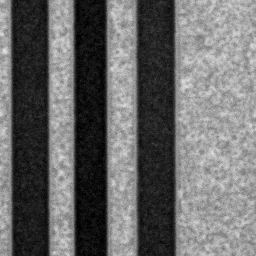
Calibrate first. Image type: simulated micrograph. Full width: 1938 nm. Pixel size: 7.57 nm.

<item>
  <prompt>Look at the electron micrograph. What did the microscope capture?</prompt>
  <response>one or a few lines or trenches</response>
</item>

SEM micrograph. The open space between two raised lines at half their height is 289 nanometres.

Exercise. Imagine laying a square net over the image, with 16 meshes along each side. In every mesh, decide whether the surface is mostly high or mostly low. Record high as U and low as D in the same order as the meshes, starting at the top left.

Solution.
UDDUUDDUUDDUUUUU
UDDUUDDUUDDUUUUU
UDDUUDDUUDDUUUUU
UDDUUDDUUDDUUUUU
UDDUUDDUUDDUUUUU
UDDUUDDUUDDUUUUU
UDDUUDDUUDDUUUUU
UDDUUDDUUDDUUUUU
UDDUUDDUUDDUUUUU
UDDUUDDUUDDUUUUU
UDDUUDDUDDDUUUUU
UDDUUDDUUDDUUUUU
UDDUUDDUDDDUUUUU
UDDUUDDUUDDUUUUU
UDDUUDDUUDDUUUUU
UDDUUDDUUDDUUUUU